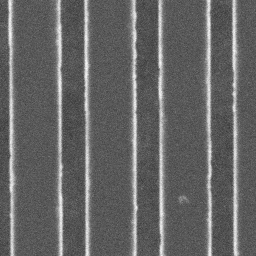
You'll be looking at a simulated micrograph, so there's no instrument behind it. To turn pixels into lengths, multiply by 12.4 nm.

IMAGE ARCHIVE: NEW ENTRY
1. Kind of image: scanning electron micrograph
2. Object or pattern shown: lines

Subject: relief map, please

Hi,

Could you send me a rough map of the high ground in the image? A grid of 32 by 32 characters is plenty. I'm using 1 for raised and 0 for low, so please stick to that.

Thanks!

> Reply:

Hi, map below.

01111110000111111000111111000111
01111110000111111000111111000111
01111110000111111000111111000111
01111110000111111000111111000111
01111110000111111000111111000111
01111110000111111000111111000111
01111110000111111000111111000111
01111111000111111000111111000111
01111110000111111000111111000111
01111110000111111000111111000111
01111110000111111000111111000111
01111111000111111000111111000111
01111111000111111000111111000111
01111111000111111000111111000111
01111111000111111000111111000111
01111111000111111000111111000111
01111111000111111000111111000111
01111111000111111000111111000111
01111111000111111000111111000111
01111111000111111000111111000111
01111111000111111000111111000111
01111111000111111000111111000111
01111111000111111000111111000111
01111111000111111000111111000111
01111111000111111000111111000111
01111111000111111000111111000111
01111111000111111000111111000111
01111111000111111000111111000111
01111111000111111000111111000111
01111111000111111000111111000111
01111111000111111000111111000111
01111111000111111000111111000111